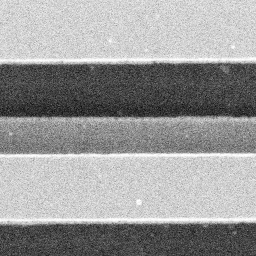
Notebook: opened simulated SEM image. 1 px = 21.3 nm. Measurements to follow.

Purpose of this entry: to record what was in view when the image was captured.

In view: lines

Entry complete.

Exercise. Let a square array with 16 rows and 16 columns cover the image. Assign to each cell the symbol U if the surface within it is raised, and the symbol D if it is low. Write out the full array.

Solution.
UUUUUUUUUUUUUUUU
UUUUUUUUUUUUUUUU
UUUUUUUUUUUUUUUU
UUUUUUUUUUUUUUUU
DDDDDDDDDDDDDDDD
DDDDDDDDDDDDDDDD
DDDDDDDDDDDDDDDD
DDDDDDDDDDDDDDDD
DDDDDDDDDDDDDDDD
DDDDDDDDDDDDDDDD
UUUUUUUUUUUUUUUU
UUUUUUUUUUUUUUUU
UUUUUUUUUUUUUUUU
UUUUUUUUUUUUUUUU
DDDDDDDDDDDDDDDD
DDDDDDDDDDDDDDDD